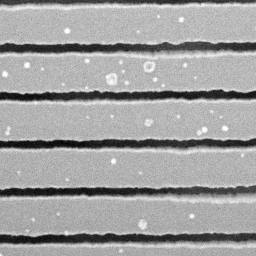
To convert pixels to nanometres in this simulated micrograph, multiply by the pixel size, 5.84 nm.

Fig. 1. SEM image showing lines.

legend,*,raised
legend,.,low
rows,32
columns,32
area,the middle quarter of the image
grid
********************************
********************************
********************************
********************************
********************************
********************************
********************************
................................
................................
********************************
********************************
********************************
********************************
********************************
********************************
********************************
********************************
********************************
********************************
................................
................................
********************************
********************************
********************************
********************************
********************************
********************************
********************************
********************************
********************************
********************************
................................